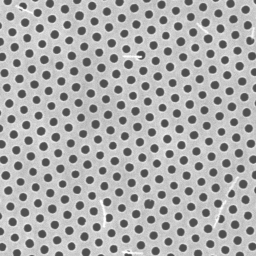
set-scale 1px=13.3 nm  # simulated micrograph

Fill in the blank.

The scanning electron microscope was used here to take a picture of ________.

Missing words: a regular array of holes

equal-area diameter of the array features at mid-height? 114 nm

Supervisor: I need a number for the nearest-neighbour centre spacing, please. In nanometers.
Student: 205